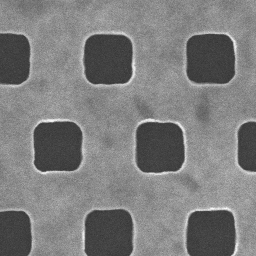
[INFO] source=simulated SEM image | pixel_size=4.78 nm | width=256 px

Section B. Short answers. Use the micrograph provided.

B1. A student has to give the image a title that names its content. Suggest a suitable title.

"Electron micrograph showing holes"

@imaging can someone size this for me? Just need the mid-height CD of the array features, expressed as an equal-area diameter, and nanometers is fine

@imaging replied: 256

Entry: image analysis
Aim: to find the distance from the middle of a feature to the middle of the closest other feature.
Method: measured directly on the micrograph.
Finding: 0.485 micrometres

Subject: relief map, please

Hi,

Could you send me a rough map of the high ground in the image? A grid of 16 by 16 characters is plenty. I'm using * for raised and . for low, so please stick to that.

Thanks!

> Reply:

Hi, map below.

****************
****************
..****..****..**
..***...****...*
..***...****...*
****************
****************
****************
**...****..****.
**...***....***.
**...****..****.
****************
****************
..****..****..**
..***...****...*
..***...****...*